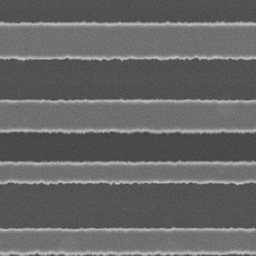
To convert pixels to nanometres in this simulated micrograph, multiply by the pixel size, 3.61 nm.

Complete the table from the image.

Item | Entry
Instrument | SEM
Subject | lines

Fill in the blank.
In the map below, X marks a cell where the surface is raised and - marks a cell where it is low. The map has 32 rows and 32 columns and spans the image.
--------------------------------
--------------------------------
--------------------------------
XXXXXXXXXXXXXXXXXXXXXXXXXXXXXXXX
XXXXXXXXXXXXXXXXXXXXXXXXXXXXXXXX
XXXXXXXXXXXXXXXXXXXXXXXXXXXXXXXX
XXXXXXXXXXXXXXXXXXXXXXXXXXXXXXXX
--------------------------------
--------------------------------
--------------------------------
--------------------------------
--------------------------------
--------------------------------
XXXXXXXXXXXXXXXXXXXXXXXXXXXXXXXX
XXXXXXXXXXXXXXXXXXXXXXXXXXXXXXXX
XXXXXXXXXXXXXXXXXXXXXXXXXXXXXXXX
X-----X-XXX----XX--XX--XXXX--XXX
--------------------------------
--------------------------------
--------------------------------
XXXXXXXXXXXXXXXXXXXXXXXXXXXXXXXX
XXXXXXXXXXXXXXXXXXXXXXXXXXXXXXXX
XXXXXXXXXXXXXXXXXXXXXXXXXXXXXXXX
--------------------------------
--------------------------------
--------------------------------
--------------------------------
--------------------------------
--------------------------------
XXXXXXXXXXXXXXXXXXXXXXXXXXXXXXXX
XXXXXXXXXXXXXXXXXXXXXXXXXXXXXXXX
XXXXXXXXXXXXXXXXXXXXXXXXXXXXXXXX